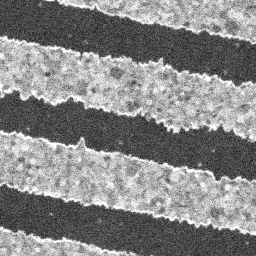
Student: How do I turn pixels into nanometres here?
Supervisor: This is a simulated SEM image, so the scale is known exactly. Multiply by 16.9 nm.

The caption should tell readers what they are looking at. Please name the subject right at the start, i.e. one or a few lines or trenches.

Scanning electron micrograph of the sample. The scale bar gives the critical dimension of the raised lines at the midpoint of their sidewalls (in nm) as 874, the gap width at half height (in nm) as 712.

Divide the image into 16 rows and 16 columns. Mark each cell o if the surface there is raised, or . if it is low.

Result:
......oooooooooo
..........oooooo
o..............o
oooooo..........
ooooooooooo.....
oooooooooooooooo
.....ooooooooooo
..........oooooo
o..............o
oooooo..........
ooooooooooo.....
oooooooooooooooo
....ooooooooo.oo
..........oooooo
o..............o
oooooo..........